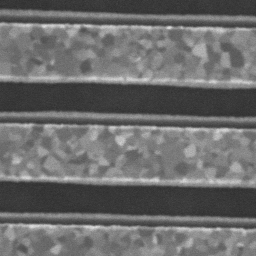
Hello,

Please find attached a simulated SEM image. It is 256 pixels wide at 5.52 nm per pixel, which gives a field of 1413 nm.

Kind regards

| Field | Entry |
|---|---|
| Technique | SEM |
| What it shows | lines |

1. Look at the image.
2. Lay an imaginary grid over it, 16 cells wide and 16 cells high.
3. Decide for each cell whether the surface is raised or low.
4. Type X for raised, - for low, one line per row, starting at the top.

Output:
----------------
XXX-------------
XXXXXXXXXXXXXXXX
XXXXXXXXXXXXXXXX
XXXXXXXXXXXXXXXX
----------------
----------------
----------------
XXXXXXXXXXXXXXXX
XXXXXXXXXXXXXXXX
XXXXXXXXXXXXXXXX
---------------X
----------------
----------------
XXXXXXXXXXXXXXXX
XXXXXXXXXXXXXXXX